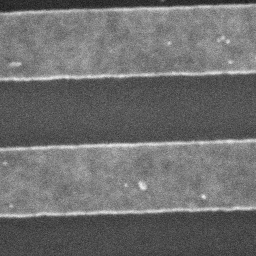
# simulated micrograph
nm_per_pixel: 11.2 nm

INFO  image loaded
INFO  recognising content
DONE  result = lines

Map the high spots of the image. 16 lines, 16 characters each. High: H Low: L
LLLLLLLLLLHHHHHH
HHHHHHHHHHHHHHHH
HHHHHHHHHHHHHHHH
HHHHHHHHHHHHHHHH
HHHHHHHHHHHHHHHH
LLLLLLLLLLLLLLLL
LLLLLLLLLLLLLLLL
LLLLLLLLLLLLLLLL
LLLLLLLLLLLLLLLL
HHHHHHHHHHHHHHHH
HHHHHHHHHHHHHHHH
HHHHHHHHHHHHHHHH
HHHHHHHHHHHHHHHH
HHLLLLLLLLLLLLLL
LLLLLLLLLLLLLLLL
LLLLLLLLLLLLLLLL